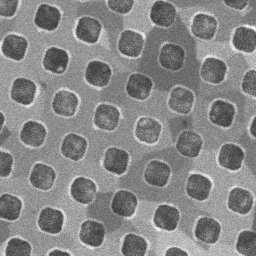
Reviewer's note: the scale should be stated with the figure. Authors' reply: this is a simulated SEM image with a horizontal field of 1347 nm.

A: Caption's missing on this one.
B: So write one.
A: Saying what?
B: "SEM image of a regular array of holes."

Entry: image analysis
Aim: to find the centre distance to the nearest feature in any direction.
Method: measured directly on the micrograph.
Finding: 228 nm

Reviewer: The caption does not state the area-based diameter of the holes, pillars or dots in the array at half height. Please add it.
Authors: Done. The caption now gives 0.142 µm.